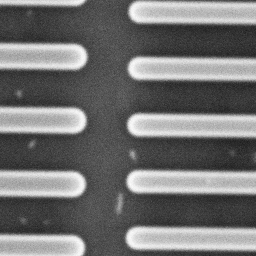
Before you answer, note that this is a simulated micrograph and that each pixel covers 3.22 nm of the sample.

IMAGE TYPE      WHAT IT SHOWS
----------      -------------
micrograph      groups of lines, slits or small figures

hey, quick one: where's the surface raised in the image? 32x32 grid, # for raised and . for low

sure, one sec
.................##########.....
................################
.................###############
................................
................................
................................
##########......................
##########.......###########....
................################
.................###############
................................
................................
................................
................................
##########.......##.............
##########......################
.................###############
................................
................................
................................
................................
................................
##########......################
##########.......###############
................................
................................
................................
................................
................................
................################
##########......################
##########......................